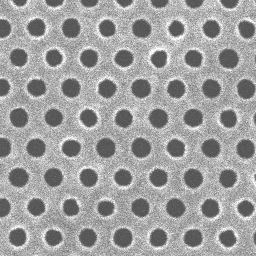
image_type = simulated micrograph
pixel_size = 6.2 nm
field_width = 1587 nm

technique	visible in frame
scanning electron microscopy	a regular array of holes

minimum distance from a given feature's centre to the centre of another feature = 213 nanometres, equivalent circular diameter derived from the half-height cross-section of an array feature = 114 nm